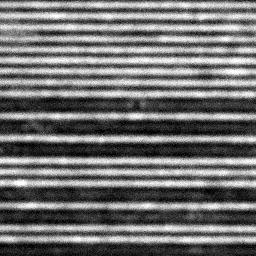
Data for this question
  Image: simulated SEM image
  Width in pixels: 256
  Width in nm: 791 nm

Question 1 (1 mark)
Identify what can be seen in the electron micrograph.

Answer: parallel lines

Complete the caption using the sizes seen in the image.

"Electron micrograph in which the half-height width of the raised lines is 14.3 nm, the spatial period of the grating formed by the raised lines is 34.5 nanometers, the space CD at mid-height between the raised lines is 20.4 nm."